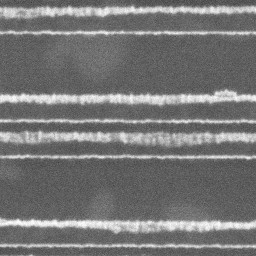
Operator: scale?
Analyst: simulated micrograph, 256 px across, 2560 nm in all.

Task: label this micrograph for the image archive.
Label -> lines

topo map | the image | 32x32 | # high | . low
................................
#...#####.######################
################################
################################
................................
................................
................................
................................
................................
................................
................................
................................
################################
################################
################################
................................
................................
################################
################################
################################
................................
................................
................................
................................
................................
................................
................................
................................
################################
################################
################################
................................